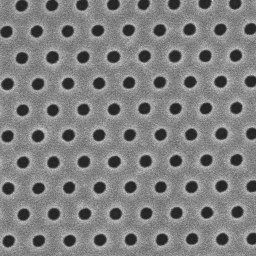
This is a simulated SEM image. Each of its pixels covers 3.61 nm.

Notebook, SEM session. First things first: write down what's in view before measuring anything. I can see a regular array of holes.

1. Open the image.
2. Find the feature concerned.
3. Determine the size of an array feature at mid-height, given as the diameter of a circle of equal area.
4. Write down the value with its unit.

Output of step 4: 43.5 nm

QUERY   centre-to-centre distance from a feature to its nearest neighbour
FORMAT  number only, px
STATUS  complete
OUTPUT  29.9